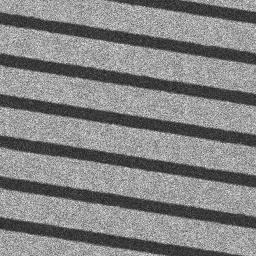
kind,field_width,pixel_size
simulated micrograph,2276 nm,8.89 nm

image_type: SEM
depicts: parallel lines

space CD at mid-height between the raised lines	103	nm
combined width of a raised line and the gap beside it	360	nanometers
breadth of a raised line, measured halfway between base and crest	254	nm